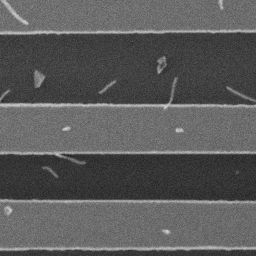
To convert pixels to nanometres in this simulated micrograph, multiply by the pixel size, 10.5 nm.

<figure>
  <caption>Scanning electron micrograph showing lines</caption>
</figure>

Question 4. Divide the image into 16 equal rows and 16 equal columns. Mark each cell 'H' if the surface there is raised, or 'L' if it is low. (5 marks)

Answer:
HHHHHHHHHHHHHHHH
HHHHHHHHHHHHHHHH
LLLLLLLLLLLLLLLL
LLLLLLLLLLLLLLLL
LLLLLLLLLLLLLLLL
LLLLLLLLLLLLLLLL
HHHHHHHLLLHLLLLL
HHHHHHHHHHHHHHHH
HHHHHHHHHHHHHHHH
HHHHHHHHHHHHHHHH
LLLLLLLLLLLLLLLL
LLLLLLLLLLLLLLLL
HLLLLLLLLLLLLLLL
HHHHHHHHHHHHHHHH
HHHHHHHHHHHHHHHH
HHHHHHHHHHHHHHHH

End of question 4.